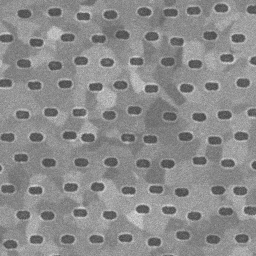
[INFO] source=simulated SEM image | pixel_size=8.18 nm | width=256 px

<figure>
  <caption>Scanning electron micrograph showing a regular array of holes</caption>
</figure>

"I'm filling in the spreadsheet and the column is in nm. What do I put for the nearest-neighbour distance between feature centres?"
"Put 207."